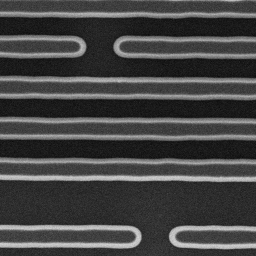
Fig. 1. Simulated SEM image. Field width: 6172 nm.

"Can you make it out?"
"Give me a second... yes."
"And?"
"groups of lines, slits or small figures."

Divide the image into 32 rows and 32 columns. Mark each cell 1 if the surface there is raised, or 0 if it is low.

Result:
11111111111111111111111111111111
11111111111111111111111111111111
00000000000000000000000000000000
00000000000000000000000000000000
00000000000000000000000000000000
11111111110000011111111111111111
11111111110000011111111111111111
00000000000000000000000000000000
00000000000000000000000000000000
00000000000000000000000000000000
11111111111111111111111111111111
11111111111111111111111111111111
00000000000000000000000000000000
00000000000000000000000000000000
00000000000000000000000000000000
11111111111111111111111111111111
11111111111111111111111111111111
00000000000000000000000000000000
00000000000000000000000000000000
00000000000000000000000000000000
11111111111111111111111111111111
11111111111111111111111111111111
00000000000000000000000000000000
00000000000000000000000000000000
00000000000000000000000000000000
00000000000000000000000000000000
00000000000000000000000000000000
00000000000000000000000000000000
11111111111111110000000111110110
11111111111111111000001111111111
11111111111111111000001111111111
00000000000000000000000000000000